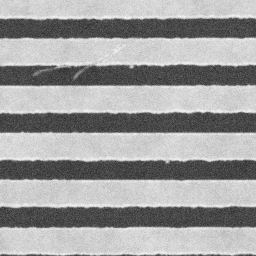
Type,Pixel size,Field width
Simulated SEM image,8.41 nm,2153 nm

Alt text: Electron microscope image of lines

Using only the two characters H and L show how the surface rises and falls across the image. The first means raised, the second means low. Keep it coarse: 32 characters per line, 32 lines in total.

HHHHHHHHHHHHHHHHHHHHHHHHHHHHHHHH
HHHHHHHHHHHHHHHHHHHHHHHHHHHHHHHH
LLLLLLLLLLLLLLLLLLLLLLLLLLLLLLLL
LLLLLLLLLLLLLLLLLLLLLLLLLLLLLLLL
LLLLLLLLLLLLLLLLLLLLLLLLLLLLLLLL
HHHHHHHHHHHHHHHHHHHHHHHHHHHHHHHH
HHHHHHHHHHHHHHHHHHHHHHHHHHHHHHHH
HHHHHHHHHHHHHHHHHHHHHHHHHHHHHHHH
LLLLLLLLLLLLLLLLLLLLLLLLLLLLLLLL
LLLLLLLLLLLLLLLLLLLLLLLLLLLLLLLL
LLLLLLLLLLLLLLLLLLLLLLLLLLLLLLLL
HHHHHHHHHHHHHHHHHHHHHHHHHHHHHHHH
HHHHHHHHHHHHHHHHHHHHHHHHHHHHHHHH
HHHHHHHHHHHHHHHHHHHHHHHHHHHHHHHH
LLLLLLLLLLLLLLLLLLLLLLLLLLLLLLLL
LLLLLLLLLLLLLLLLLLLLLLLLLLLLLLLL
LLLLLLLLLLLLLLLLLLLLLLLLLLLLLLLL
HHHHHHHHHHHHHHHHHHHHHHHHHHHHHHHH
HHHHHHHHHHHHHHHHHHHHHHHHHHHHHHHH
HHHHHHHHHHHHHHHHHHHHHHHHHHHHHHHH
LLLLLLLLLLLLLLLLLLLLLLLLLLLLLLLL
LLLLLLLLLLLLLLLLLLLLLLLLLLLLLLLL
HHLHHLHHLHLLLLLLLLLLLLLLLLLLLLLL
HHHHHHHHHHHHHHHHHHHHHHHHHHHHHHHH
HHHHHHHHHHHHHHHHHHHHHHHHHHHHHHHH
HHHHHHHHHHHHHHHHHHHHHHHHHHHHHHHH
LLLLLLLLLLLLLLLLLLLLLLLLLLLLLLLL
LLLLLLLLLLLLLLLLLLLLLLLLLLLLLLLL
HHHHHLHHHHHHHHLLHHHHHHHHHHHHHHHH
HHHHHHHHHHHHHHHHHHHHHHHHHHHHHHHH
HHHHHHHHHHHHHHHHHHHHHHHHHHHHHHHH
HHHHHHHHHHHHHHHHHHHHHHHHHHHHHHHH